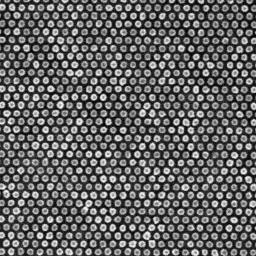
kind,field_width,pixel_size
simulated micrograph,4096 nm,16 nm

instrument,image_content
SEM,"a regular array of raised bodies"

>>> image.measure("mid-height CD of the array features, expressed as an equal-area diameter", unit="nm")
95.6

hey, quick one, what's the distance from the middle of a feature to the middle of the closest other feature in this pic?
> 0.146 microns